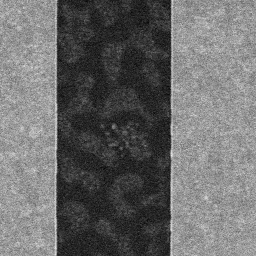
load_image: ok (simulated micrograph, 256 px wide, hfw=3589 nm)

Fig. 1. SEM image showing one or a few lines or trenches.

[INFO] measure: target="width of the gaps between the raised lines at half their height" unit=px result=115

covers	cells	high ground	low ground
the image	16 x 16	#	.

####.......#####
####.......#####
####.......#####
####.......#####
####.......#####
###........#####
###........#####
###........#####
###........#####
###........#####
###........#####
###........#####
###........#####
###........#####
###........#####
###........#####